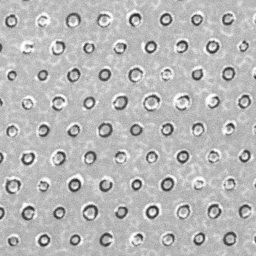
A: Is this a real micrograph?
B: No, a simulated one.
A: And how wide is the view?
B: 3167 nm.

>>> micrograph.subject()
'a regular array of ring-shaped grooves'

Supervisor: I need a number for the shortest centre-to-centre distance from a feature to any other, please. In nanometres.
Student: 377